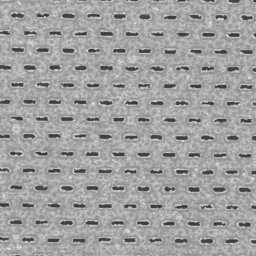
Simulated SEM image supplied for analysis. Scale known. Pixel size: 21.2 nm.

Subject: a regular array of holes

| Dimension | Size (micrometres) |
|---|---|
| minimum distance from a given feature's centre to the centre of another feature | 0.445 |